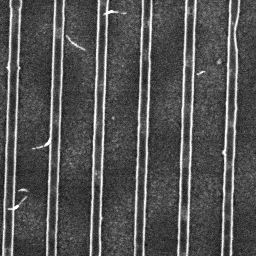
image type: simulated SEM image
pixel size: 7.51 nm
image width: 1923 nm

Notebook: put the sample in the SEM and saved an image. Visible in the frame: parallel lines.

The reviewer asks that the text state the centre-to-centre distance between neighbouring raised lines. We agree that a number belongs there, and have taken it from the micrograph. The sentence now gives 0.328 um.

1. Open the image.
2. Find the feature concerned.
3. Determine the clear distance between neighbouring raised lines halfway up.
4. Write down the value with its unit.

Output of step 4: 0.258 microns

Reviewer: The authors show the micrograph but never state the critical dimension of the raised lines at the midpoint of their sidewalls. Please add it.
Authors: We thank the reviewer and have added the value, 69.4 nanometres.